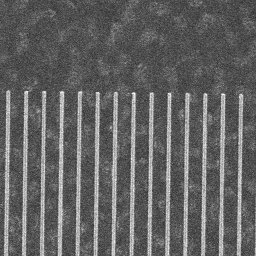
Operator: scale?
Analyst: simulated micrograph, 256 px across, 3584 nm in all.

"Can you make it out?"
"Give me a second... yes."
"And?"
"parallel lines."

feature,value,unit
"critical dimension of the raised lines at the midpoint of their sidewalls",33.2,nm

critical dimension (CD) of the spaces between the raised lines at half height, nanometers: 214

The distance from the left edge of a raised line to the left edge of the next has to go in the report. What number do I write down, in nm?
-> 251